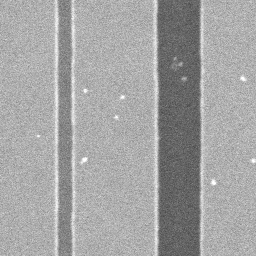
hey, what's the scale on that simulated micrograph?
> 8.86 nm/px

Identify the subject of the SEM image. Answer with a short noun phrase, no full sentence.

lines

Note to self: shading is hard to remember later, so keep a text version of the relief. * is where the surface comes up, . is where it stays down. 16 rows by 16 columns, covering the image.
**********...***
**********...***
**********...***
**********...***
**********...***
**********...***
**********...***
**********...***
**********...***
**********...***
**********...***
**********...***
**********...***
**********...***
**********...***
**********...***